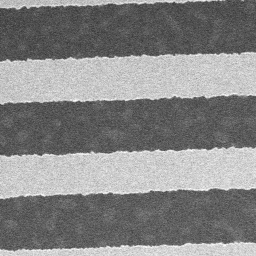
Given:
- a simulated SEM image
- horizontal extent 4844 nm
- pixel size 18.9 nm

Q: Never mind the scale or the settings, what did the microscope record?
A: one or a few lines or trenches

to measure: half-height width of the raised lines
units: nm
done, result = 775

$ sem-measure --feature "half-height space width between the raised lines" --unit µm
1.02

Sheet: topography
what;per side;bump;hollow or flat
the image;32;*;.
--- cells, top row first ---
*************...................
................................
................................
................................
................................
................................
................................
......**************************
********************************
********************************
********************************
********************************
*************...................
................................
................................
................................
................................
...........................*....
.............................*..
...*****************************
********************************
********************************
********************************
********************************
***.............................
................................
................................
................................
................................
................................
.......................*.*.*.***
********************************